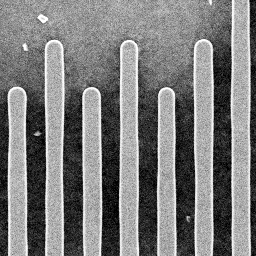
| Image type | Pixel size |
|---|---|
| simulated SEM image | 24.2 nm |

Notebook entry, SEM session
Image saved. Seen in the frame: groups of lines, slits or small figures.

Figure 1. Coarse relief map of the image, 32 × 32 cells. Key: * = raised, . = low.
.............................**.
.............................**.
.............................**.
.............................**.
.............................**.
......**.......**........*...**.
......**.......**.......**...**.
......**.......**.......**...**.
......**.......**.......***..**.
......**.......**.......***..**.
......**.......**.......***..**.
.**...**..**...**...**..***..**.
.**...**..***..**...**..***..**.
.**...**..***..**...**..***..**.
.**...**..***..**...**..***..**.
.**...**..***..**...**..***..**.
.**...**..***..**...**..***..**.
.**...**..***..**...**..***..**.
.**...**..***..**...**..***..**.
.**...**..***..**...**..***..**.
.**...**..***..**...**..***..**.
.**...**..***..**...**..***..**.
.**...**..***..**...**...**..**.
.**...**..***..**...**...**..**.
.**...**..***..**...**...**..**.
.**...**..***..**...**..***..**.
.**...**..***..**...**..***..**.
.**...**..***..**...**..***..**.
.**...**..***..**...**..***..**.
.**...**..***..**...**..***..**.
.**...**..***..**...**..***..**.
.**...**..***..**...**..***..**.